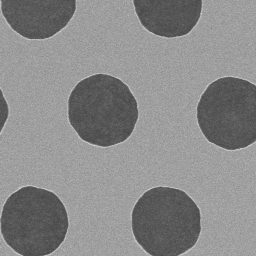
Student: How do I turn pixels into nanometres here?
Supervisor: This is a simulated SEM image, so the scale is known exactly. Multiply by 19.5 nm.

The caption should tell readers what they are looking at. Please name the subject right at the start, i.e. holes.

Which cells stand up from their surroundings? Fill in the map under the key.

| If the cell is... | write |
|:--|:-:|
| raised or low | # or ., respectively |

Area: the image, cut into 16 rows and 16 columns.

.....###.....###
#...#####...####
################
################
################
#####...#####...
####.....###....
####.....###....
#####...#####...
################
################
################
....#####...####
....####.....###
....####....####
#...#####...####